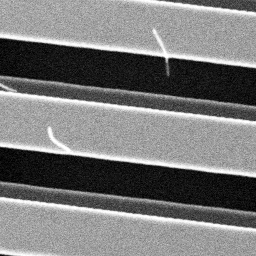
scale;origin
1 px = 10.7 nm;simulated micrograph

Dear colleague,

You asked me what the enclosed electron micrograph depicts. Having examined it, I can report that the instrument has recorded lines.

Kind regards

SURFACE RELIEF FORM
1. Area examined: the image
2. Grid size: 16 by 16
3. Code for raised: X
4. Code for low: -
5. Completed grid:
XXXXXXXXXXXXXXXX
XXXXXXXXXXXXXXXX
--XXXXXXXXXXXXXX
----------XXXXXX
----------------
XXXXXX----------
XXXXXXXXXXXXXXX-
XXXXXXXXXXXXXXXX
XXXXXXXXXXXXXXXX
---XXXXXXXXXXXXX
-----------XXXXX
X---------------
XXXXXXXXX-------
XXXXXXXXXXXXXXXX
XXXXXXXXXXXXXXXX
XXXXXXXXXXXXXXXX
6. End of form